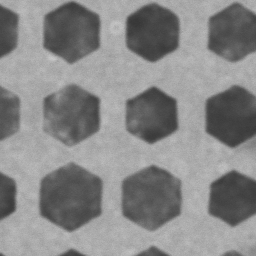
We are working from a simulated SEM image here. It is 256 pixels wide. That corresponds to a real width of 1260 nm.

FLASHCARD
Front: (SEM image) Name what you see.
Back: holes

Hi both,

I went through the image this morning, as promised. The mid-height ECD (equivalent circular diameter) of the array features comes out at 292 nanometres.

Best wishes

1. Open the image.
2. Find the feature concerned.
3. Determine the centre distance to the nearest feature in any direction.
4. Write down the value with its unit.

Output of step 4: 397 nanometres